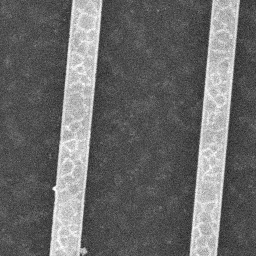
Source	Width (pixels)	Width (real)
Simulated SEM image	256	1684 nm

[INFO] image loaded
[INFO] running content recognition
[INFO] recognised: one or a few lines or trenches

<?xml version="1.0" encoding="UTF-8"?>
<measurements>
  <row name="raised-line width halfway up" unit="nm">177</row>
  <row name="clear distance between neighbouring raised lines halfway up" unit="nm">733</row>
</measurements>